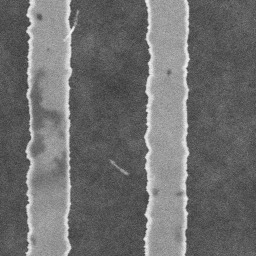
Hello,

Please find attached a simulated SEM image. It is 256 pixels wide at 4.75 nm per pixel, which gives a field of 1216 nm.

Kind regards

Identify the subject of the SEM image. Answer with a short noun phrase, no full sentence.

lines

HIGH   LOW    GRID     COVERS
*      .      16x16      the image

..**.....***....
..**.....***....
..**.....***....
..**.....***....
..**.....***....
..**.....***....
..**.....***....
..**.....***....
..**.....***....
..**.....***....
..**.....***....
..**.....***....
..**.....***....
..**.....***....
..**.....***....
..**.....***....